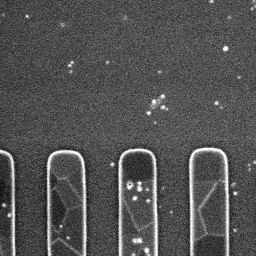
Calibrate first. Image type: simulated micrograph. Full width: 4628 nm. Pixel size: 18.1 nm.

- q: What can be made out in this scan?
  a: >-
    wiring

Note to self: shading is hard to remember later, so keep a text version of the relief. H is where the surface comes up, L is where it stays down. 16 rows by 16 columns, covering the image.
LLLLLLLLLLLLLLLL
LLLLLLLLLLLLLLLL
LLLLLLLLLLLLLLLL
LLLLLLLLLLLLLLLL
LLLLLLLLLLLLLLLL
LLLLLLLLLLLLLLLL
LLLLLLLLLLLLLLLL
LLLLLLLLLLLLLLLL
LLLLLLLLLLLLLLLL
LLLLHLLLHLLLHHLL
HLLHHLLHHHLLHHLL
HLLHHLLHHHLLHHLL
HLLHHLLHHHLLHHLL
HLLHHLLHHHLLHHLL
HLLHHLLHHHLLHHLL
HLLHHLLHHHLLHHLL